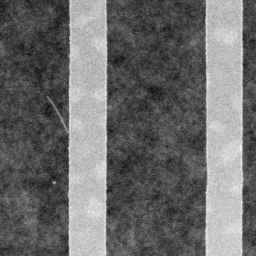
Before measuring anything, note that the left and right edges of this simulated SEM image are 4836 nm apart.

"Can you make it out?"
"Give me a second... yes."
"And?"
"one or a few lines or trenches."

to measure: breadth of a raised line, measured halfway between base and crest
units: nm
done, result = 675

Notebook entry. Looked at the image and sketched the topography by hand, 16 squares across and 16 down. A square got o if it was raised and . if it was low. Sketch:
....ooo......oo.
....ooo......oo.
....ooo......oo.
....ooo......oo.
....ooo......oo.
....ooo......oo.
....ooo......oo.
....ooo......oo.
....ooo......oo.
....ooo......oo.
....ooo......oo.
....ooo......oo.
....ooo......oo.
....ooo......oo.
....ooo......oo.
....ooo......oo.